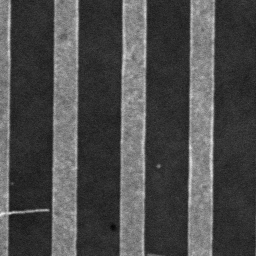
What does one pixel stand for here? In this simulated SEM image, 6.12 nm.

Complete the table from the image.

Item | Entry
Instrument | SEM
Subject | wiring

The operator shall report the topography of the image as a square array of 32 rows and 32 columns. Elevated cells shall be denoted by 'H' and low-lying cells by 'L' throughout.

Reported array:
HLLLLLLHHHLLLLLHHHLLLLLLHHHLLLLL
HLLLLLLHHHLLLLLHHHLLLLLLHHHLLLLL
HLLLLLLHHHLLLLLHHHLLLLLLHHHLLLLL
HLLLLLLHHHLLLLLHHHLLLLLLHHHLLLLL
HLLLLLLHHHLLLLLLHHLLLLLLHHHLLLLL
HLLLLLLHHHLLLLLLHHLLLLLLHHHLLLLL
HLLLLLLHHHLLLLLLHHLLLLLLHHHLLLLL
HLLLLLLHHHLLLLLHHHLLLLLLHHHLLLLL
HLLLLLLHHHLLLLLHHHLLLLLLHHHLLLLL
HLLLLLLHHHLLLLLHHHLLLLLLHHHLLLLL
HLLLLLLHHHLLLLLHHHLLLLLLHHHLLLLL
HLLLLLLHHHLLLLLHHHLLLLLLHHHLLLLL
HLLLLLLHHHLLLLLHHHLLLLLLHHHLLLLL
HLLLLLLHHHLLLLLHHHLLLLLLHHHLLLLL
HLLLLLLHHHLLLLLHHHLLLLLLHHHLLLLL
HLLLLLLHHHLLLLLHHHLLLLLLHHLLLLLL
HLLLLLLHHHLLLLLHHHLLLLLLHHLLLLLL
HLLLLLLHHHLLLLLHHHLLLLLLHHLLLLLL
HLLLLLLHHHLLLLLHHHLLLLLLHHLLLLLL
HLLLLLLHHHLLLLLHHHLLLLLLHHLLLLLL
HLLLLLLHHHLLLLLHHHLLLLLLHHLLLLLL
HLLLLLLHHHLLLLLHHHLLLLLLHHLLLLLL
HLLLLLLHHHLLLLLHHHLLLLLLHHLLLLLL
HLLLLLLHHHLLLLLHHHLLLLLLHHLLLLLL
HLLLLLLHHLLLLLLHHHLLLLLLHHLLLLLL
HLLLLLLHHLLLLLLHHHLLLLLLHHLLLLLL
HLLLLLLHHLLLLLLHHHLLLLLLHHLLLLLL
HLLLLLLHHLLLLLLHHHLLLLLLHHLLLLLL
HLLLLLLHHLLLLLLHHHLLLLLLHHLLLLLL
HLLLLLLHHLLLLLLHHHLLLLLLHHLLLLLL
HLLLLLLHHLLLLLLHHHLLLLLLHHLLLLLL
HLLLLLLHHLLLLLLHHHLLLLLLHHLLLLLL